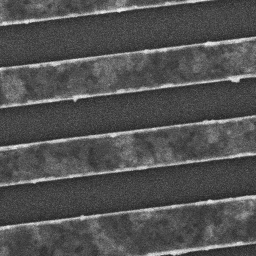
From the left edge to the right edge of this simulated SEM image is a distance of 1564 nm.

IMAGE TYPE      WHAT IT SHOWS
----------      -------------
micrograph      one or a few lines or trenches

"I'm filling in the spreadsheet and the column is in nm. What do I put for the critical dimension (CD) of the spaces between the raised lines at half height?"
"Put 246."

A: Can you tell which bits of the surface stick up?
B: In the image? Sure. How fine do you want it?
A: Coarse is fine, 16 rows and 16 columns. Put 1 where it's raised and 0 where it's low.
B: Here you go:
1111111110000000
1000000000000000
0000000000000011
0000001111111111
1111111111111111
1111111111000000
1100000000000000
0000000000000011
0000001111111111
1111111111111111
1111111110000000
1000000000000000
0000000000000011
0000011111111111
1111111111111111
1111111111111000